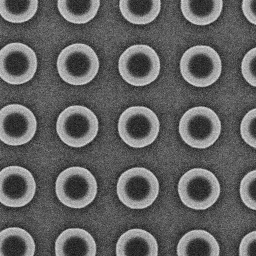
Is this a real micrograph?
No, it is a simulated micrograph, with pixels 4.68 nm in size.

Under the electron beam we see an array of small figures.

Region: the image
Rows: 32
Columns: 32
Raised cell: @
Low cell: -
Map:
@@@@@--@@@@@---@@@@@---@@@@@--@@
@@@@----@@@@---@@@@@---@@@@@--@@
-@@-----@@@-----@@@-----@@@----@
--------------------------------
--------------------------------
-@@-----------------------------
@@@@----@@@@----@@@----@@@@----@
@@@@@--@@@@@---@@@@@---@@@@@--@@
@@@@@--@@@@@---@@@@@---@@@@@--@@
@@@@----@@@@---@@@@@---@@@@---@@
---------@------@@------@@-----@
--------------------------------
--------------------------------
@@@-----@@@-----@@------@@------
@@@@---@@@@@---@@@@----@@@@----@
@@@@---@@@@@---@@@@@--@@@@@@--@@
@@@@---@@@@@---@@@@@--@@@@@---@@
@@@@----@@@----@@@@----@@@@----@
--------------------------------
--------------------------------
--------------------------------
@@@@----@@@-----@@@----@@@-----@
@@@@---@@@@@---@@@@@---@@@@---@@
@@@@---@@@@@---@@@@@--@@@@@---@@
@@@@---@@@@@---@@@@@--@@@@@---@@
-@@-----@@@-----@@@----@@@@----@
--------------------------------
--------------------------------
--------------------------------
@@@@---@@@@----@@@@----@@@-----@
@@@@---@@@@@---@@@@@--@@@@@---@@
@@@@---@@@@@---@@@@@--@@@@@---@@